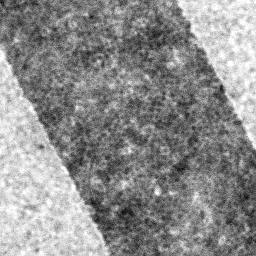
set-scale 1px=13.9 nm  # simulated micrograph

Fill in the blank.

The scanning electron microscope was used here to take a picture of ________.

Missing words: one or a few lines or trenches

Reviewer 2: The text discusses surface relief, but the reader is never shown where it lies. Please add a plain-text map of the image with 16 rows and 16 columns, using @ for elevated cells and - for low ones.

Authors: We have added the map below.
-----------@@@@@
------------@@@@
------------@@@@
-------------@@@
@-------------@@
@-------------@@
@@-------------@
@@-------------@
@@@-------------
@@@-------------
@@@@------------
@@@@@-----------
@@@@@-----------
@@@@@@----------
@@@@@@----------
@@@@@@@---------